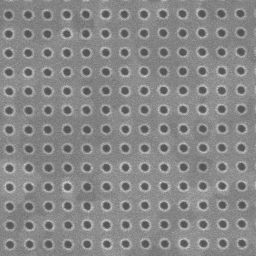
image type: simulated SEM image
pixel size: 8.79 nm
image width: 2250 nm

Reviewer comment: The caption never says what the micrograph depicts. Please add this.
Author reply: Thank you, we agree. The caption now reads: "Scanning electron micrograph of a regular array of holes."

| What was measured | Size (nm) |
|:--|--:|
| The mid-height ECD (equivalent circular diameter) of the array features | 74.2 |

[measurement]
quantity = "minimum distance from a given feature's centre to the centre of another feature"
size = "166 nanometres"